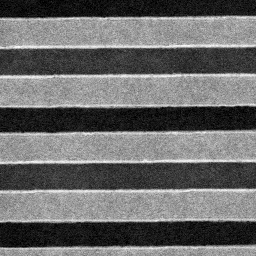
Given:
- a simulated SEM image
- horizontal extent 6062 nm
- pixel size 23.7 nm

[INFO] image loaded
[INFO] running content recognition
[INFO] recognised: lines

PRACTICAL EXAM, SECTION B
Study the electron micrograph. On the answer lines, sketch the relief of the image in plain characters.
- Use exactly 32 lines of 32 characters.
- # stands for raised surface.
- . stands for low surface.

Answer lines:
................................
................................
################################
################################
################################
################################
................................
................................
................................
...............#################
################################
################################
################################
................................
................................
................................
................................
################################
################################
################################
................................
................................
................................
................................
################################
################################
################################
######################..........
................................
................................
................................
################################